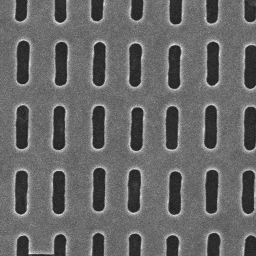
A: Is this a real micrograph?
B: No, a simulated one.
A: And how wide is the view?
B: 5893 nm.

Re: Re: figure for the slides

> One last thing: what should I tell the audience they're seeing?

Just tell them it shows a regular array of holes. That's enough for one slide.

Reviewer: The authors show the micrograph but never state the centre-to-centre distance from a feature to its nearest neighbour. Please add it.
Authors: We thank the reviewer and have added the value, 36.7 px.